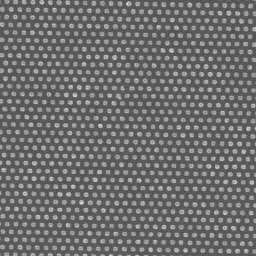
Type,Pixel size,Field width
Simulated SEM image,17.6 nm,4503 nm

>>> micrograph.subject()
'a regular array of raised bodies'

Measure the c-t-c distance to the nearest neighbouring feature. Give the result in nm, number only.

150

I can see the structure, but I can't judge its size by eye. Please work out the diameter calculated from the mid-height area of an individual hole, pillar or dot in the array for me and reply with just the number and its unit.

74.3 nm